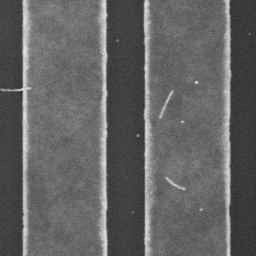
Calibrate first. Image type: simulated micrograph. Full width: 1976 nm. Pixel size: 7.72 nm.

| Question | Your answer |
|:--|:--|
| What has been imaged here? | lines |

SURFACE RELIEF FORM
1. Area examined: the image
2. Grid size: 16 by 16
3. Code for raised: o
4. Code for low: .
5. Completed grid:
..ooooo..ooooo..
..ooooo..ooooo..
..ooooo..ooooo..
.oooooo..ooooo..
.oooooo..ooooo..
.oooooo..ooooo..
.oooooo..ooooo..
.oooooo..ooooo..
.oooooo..ooooo..
.oooooo..ooooo..
.oooooo..ooooo..
..ooooo..ooooo..
..ooooo..ooooo..
..ooooo..ooooo..
..ooooo..ooooo..
.oooooo..ooooo..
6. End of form